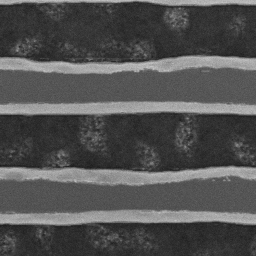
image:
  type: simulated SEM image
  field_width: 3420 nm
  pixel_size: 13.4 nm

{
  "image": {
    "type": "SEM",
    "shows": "one or a few lines or trenches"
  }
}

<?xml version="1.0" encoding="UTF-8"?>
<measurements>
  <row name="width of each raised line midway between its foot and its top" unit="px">43.2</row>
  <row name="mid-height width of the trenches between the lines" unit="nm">867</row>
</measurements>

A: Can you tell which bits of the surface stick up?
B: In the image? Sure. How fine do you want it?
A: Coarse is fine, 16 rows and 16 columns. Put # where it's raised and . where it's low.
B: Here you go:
................
................
................
................
################
################
################
................
................
................
................
################
################
################
................
................